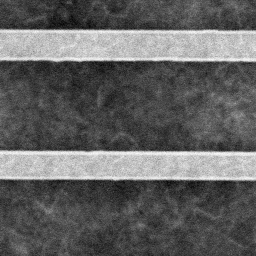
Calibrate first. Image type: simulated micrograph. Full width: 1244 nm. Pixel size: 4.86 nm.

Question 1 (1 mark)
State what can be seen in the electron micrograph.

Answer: one or a few lines or trenches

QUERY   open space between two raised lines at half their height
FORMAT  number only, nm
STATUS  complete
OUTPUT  455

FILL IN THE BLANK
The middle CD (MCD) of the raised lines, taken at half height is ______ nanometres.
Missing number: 128